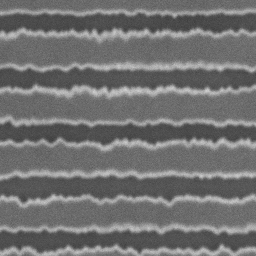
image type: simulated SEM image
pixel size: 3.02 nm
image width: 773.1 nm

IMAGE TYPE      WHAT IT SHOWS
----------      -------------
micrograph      lines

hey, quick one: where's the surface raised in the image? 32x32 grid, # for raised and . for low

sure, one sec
################################
################################
................................
................................
################################
################################
################################
################################
..#######.#.############.###.###
................................
................................
################################
################################
################################
################################
..####...#.#.###.###.##...######
................................
.......#...................#....
################################
################################
################################
################################
................................
................................
...............................#
################################
################################
################################
################################
................................
................................
#####..##########.##############